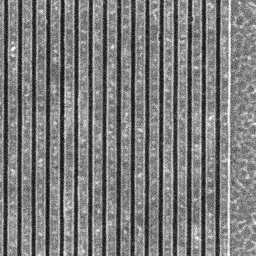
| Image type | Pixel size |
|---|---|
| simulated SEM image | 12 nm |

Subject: parallel lines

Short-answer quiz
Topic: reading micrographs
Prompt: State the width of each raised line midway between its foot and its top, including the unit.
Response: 9.37 px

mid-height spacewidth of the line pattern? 56.8 nanometers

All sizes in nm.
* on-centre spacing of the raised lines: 169